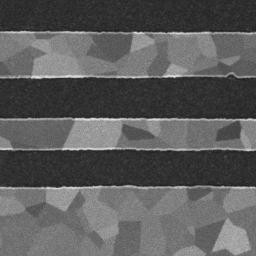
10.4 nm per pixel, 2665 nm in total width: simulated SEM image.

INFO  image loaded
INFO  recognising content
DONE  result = one or a few lines or trenches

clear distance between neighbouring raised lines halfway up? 416 nm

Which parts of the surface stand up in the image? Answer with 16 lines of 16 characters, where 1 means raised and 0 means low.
0000000000000000
0000000000000000
1111111111111111
1111111111111111
1111111111111111
0000000000000000
0000000000000000
1111111111111111
1111111111111111
0000000000000000
0000000000000000
0000000000000000
1111111111111111
1111111111111111
1111111111111111
1111111111111111